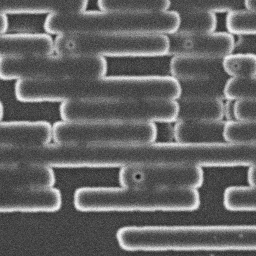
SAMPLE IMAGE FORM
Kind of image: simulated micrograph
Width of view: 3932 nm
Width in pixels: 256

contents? wiring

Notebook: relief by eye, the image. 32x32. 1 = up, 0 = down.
11111111111011111111100000000001
11110011111111111111110000000111
10000011111111111111110000001111
10000011111111111111110000000111
11111101111111111111100000000000
11111111111111111111100000000000
11111111111111111111100000000000
11111111111110000000000000001111
11111111111110000000000000001111
11111111111110000000000000000111
00111111111111111111110000001111
00111111111111111111111000001111
00011111111111111111110000000111
00000000111111111111110000000111
00000000111111111111110000000111
11111101111111111110000000001111
11111111111111111110000000001111
11111111111111111110000000001111
11111111111111111111111111111111
11111111111111111111111111111111
11111111111111111111111111111111
11111110000000011111111110000001
11111110000000011111111110000001
11111110000000011111111110000111
11111110001111111111111110001111
11111111011111111111111110001111
00000000000000000000000000000000
00000000000000000000000000000000
00000000000000000000111111111111
00000000000000011111111111111111
00000000000000011111111111111111
00000000000000000000000000000000